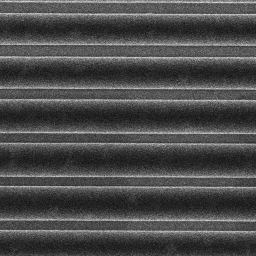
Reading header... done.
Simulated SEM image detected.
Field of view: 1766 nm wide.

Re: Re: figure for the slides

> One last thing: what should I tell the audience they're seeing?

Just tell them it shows parallel lines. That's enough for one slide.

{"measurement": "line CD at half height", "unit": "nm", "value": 233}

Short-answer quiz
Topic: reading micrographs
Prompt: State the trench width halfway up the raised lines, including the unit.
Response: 72 nm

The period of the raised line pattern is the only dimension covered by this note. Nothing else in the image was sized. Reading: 0.301 microns